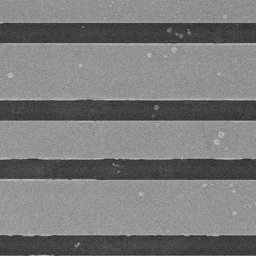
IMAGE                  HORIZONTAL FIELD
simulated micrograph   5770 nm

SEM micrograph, lines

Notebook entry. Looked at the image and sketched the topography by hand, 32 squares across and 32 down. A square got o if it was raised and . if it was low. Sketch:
oooooooooooooooooooooooooooooooo
oooooooooooooooooooooooooooooooo
oooooooooooooooooooooooooooooooo
................................
................................
oooooooooooooooooooooooooooooooo
oooooooooooooooooooooooooooooooo
oooooooooooooooooooooooooooooooo
oooooooooooooooooooooooooooooooo
oooooooooooooooooooooooooooooooo
oooooooooooooooooooooooooooooooo
oooooooooooooooooooooooooooooooo
................................
................................
................................
oooooooooooooooooooooooooooooooo
oooooooooooooooooooooooooooooooo
oooooooooooooooooooooooooooooooo
oooooooooooooooooooooooooooooooo
oooooooooooooooooooooooooooooooo
................................
................................
oooooo..........................
oooooooooooooooooooooooooooooooo
oooooooooooooooooooooooooooooooo
oooooooooooooooooooooooooooooooo
oooooooooooooooooooooooooooooooo
oooooooooooooooooooooooooooooooo
oooooooooooooooooooooooooooooooo
................................
................................
................................